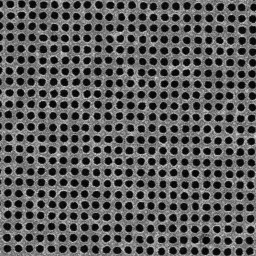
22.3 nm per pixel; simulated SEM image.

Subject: a regular array of holes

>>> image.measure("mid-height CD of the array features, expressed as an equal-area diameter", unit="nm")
176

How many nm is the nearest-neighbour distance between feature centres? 234